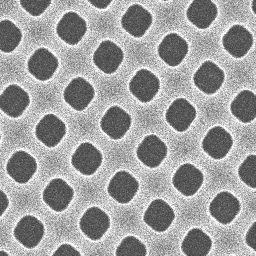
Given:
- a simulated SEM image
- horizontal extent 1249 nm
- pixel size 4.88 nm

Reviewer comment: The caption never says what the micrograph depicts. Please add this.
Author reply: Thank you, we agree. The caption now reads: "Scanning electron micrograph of a regular array of holes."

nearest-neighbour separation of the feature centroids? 225 nm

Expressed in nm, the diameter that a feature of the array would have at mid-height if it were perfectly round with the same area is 149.